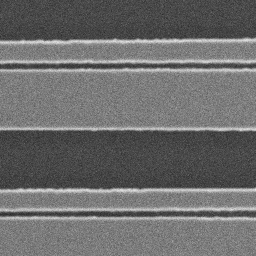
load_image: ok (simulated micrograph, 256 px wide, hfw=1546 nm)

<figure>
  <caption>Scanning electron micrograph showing lines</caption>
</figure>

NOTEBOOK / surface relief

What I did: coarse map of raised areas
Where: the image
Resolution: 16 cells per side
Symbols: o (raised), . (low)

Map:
................
................
............oo.o
oooooooooooooooo
oooooooooooooooo
oooooooooooooooo
oooooooooooooooo
oooooooooooooooo
................
................
................
................
oooooooooooooooo
oooooooooooooooo
oooooooooooooooo
oooooooooooooooo